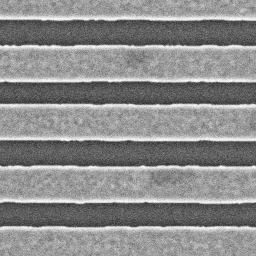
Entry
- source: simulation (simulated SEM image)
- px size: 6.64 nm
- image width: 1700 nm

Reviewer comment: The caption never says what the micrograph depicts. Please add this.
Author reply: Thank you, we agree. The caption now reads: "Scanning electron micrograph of lines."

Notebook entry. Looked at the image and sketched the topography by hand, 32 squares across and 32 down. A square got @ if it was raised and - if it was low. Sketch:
@@@@@@@@@@@@@@@@@@@@@@@@@@@@@@@@
@@@@@@@@@@@@@@@@@@@@@@@@@@@@@@@@
--------------------------------
--------------------------------
--------------------------------
--------------------------------
@@@@@@@@@@@@@@@@@@@@@@@@@@@@@@@@
@@@@@@@@@@@@@@@@@@@@@@@@@@@@@@@@
@@@@@@@@@@@@@@@@@@@@@@@@@@@@@@@@
@@@@@@@@@@@@@@@@@@@@@@@@@@@@@@@@
--------------------------------
--------------------------------
--------------------------------
@@@@@@@@@@@@@@@@@@@@@@@@@@@@@@@@
@@@@@@@@@@@@@@@@@@@@@@@@@@@@@@@@
@@@@@@@@@@@@@@@@@@@@@@@@@@@@@@@@
@@@@@@@@@@@@@@@@@@@@@@@@@@@@@@@@
-------------@@-@@@@@@@@@-@@@@@@
--------------------------------
--------------------------------
--------------------------------
@@@@@@@@@@@@@@@@@@@@@@@@@@@@@@@@
@@@@@@@@@@@@@@@@@@@@@@@@@@@@@@@@
@@@@@@@@@@@@@@@@@@@@@@@@@@@@@@@@
@@@@@@@@@@@@@@@@@@@@@@@@@@@@@@@@
--------------------------------
--------------------------------
--------------------------------
@@@@-@@@@----@@@@@@@@@@@@@@@@@@@
@@@@@@@@@@@@@@@@@@@@@@@@@@@@@@@@
@@@@@@@@@@@@@@@@@@@@@@@@@@@@@@@@
@@@@@@@@@@@@@@@@@@@@@@@@@@@@@@@@